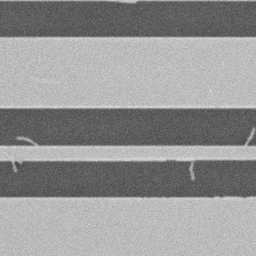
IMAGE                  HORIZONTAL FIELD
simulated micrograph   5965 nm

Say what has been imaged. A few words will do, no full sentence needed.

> lines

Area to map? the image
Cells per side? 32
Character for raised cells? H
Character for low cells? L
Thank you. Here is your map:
LLLLLLLLLLLLLLLLLLLLLLLLLLLLLLLL
LLLLLLLLLLLLLLLLLLLLLLLLLLLLLLLL
LLLLLLLLLLLLLLLLLLLLLLLLLLLLLLLL
LLLLLLLLLLLLLLLLLLLLLLLLLLLLLLLL
LLLLLLLLLLLLLLLLLLLLLLLLLLLLLLLL
HHHHHHHHHHHHHHHHHHHHHHHHHHHHHHHH
HHHHHHHHHHHHHHHHHHHHHHHHHHHHHHHH
HHHHHHHHHHHHHHHHHHHHHHHHHHHHHHHH
HHHHHHHHHHHHHHHHHHHHHHHHHHHHHHHH
HHHHHHHHHHHHHHHHHHHHHHHHHHHHHHHH
HHHHHHHHHHHHHHHHHHHHHHHHHHHHHHHH
HHHHHHHHHHHHHHHHHHHHHHHHHHHHHHHH
HHHHHHHHHHHHHHHHHHHHHHHHHHHHHHHH
LLLLLLLLLLLLLLLLLLLLLLLLLLLLLLLL
LLLLLLLLLLLLLLLLLLLLLLLLLLLLLLLL
LLLLLLLLLLLLLLLLLLLLLLLLLLLLLLLL
LLLLLLLLLLLLLLLLLLLLLLLLLLLLLLLL
LLLLLLLLLLLLLLLLLLLLLLLLLLLLLLLL
HHHHHHHHHHHHHHHHHHHHHHHHHHHHHHHH
HHHHHHHHHHHHHHHHHHHHHHHHHHHHHHHH
LLLLLLLLLLLLLLLLLLLLLLLLLLLLLLLL
LLLLLLLLLLLLLLLLLLLLLLLLLLLLLLLL
LLLLLLLLLLLLLLLLLLLLLLLLLLLLLLLL
LLLLLLLLLLLLLLLLLLLLLLLLLLLLLLLL
LLLLLLLLLLLLLLLLLLLLLLLLLLLLLLLL
HHHHHHHHHHHHHHHHHHHHHHHHHHHHHHHH
HHHHHHHHHHHHHHHHHHHHHHHHHHHHHHHH
HHHHHHHHHHHHHHHHHHHHHHHHHHHHHHHH
HHHHHHHHHHHHHHHHHHHHHHHHHHHHHHHH
HHHHHHHHHHHHHHHHHHHHHHHHHHHHHHHH
HHHHHHHHHHHHHHHHHHHHHHHHHHHHHHHH
HHHHHHHHHHHHHHHHHHHHHHHHHHHHHHHH